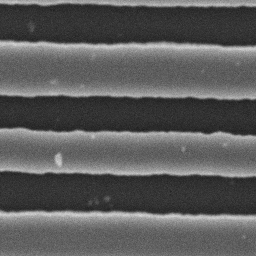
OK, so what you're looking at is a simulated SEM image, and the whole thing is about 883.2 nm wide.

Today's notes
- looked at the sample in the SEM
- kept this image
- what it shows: lines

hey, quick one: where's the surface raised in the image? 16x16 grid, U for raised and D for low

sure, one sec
DDDDDDDDDDDDDDDD
DDDDDDDDDDDDDDDD
DDDDDDDDDDDDDDDD
UUUUUUUUUUUUUUUU
UUUUUUUUUUUUUUUU
UUUUUUUUUUUUUUUU
DDDDDDDDDDDDDDDD
DDDDDDDDDDDDDDDD
UUUUUUUUUUUUUUUU
UUUUUUUUUUUUUUUU
UUUUUUUUUUUUUUUU
DDDDDDDDDDDDDDDD
DDDDDDDDDDDDDDDD
UUUUUUUUUUUUDDDD
UUUUUUUUUUUUUUUU
UUUUUUUUUUUUUUUU